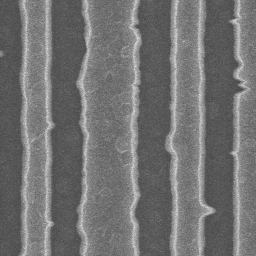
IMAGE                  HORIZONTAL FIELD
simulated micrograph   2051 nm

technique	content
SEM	one or a few lines or trenches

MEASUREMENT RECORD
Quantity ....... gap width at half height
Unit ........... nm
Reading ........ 275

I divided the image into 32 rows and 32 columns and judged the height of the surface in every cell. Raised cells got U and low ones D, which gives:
DDDUUUDDDDUUUUUUUDDDDDUUUDDDDDUU
DDDUUUDDDDDUUUUUUDDDDDUUUDDDDDUU
DDDUUUDDDDDUUUUUUDDDDDUUUDDDDUUU
DDDUUUDDDDDUUUUUUDDDDDUUUDDDDUUU
DDDUUUDDDDDUUUUUUDDDDDUUUDDDDDUU
DDDUUUDDDDDUUUUUUDDDDDUUUDDDDDUU
DDDUUUDDDDDUUUUUUDDDDDUUUDDDDDUU
DDDUUUDDDDDUUUUUUDDDDDUUUDDDDDUU
DDDUUUDDDDUUUUUUUDDDDDUUUDDDDDUU
DDDUUUDDDDUUUUUUUDDDDDUUUDDDDUUU
DDDUUUDDDDUUUUUUUDDDDDUUUDDDDDUU
DDDUUUDDDDUUUUUUUDDDDDUUUDDDDDUU
DDDUUUDDDDUUUUUUUDDDDDUUUDDDDDUU
DDDUUUDDDDUUUUUUUDDDDUUUUDDDDUUU
DDDUUUDDDDUUUUUUUDDDDDUUUDDDDDUU
DDDUUUDDDDUUUUUUUDDDDDUUUDDDDUUU
DDDUUUDDDDDUUUUUUDDDDUUUUDDDDUUU
DDDUUUDDDDDUUUUUUDDDDUUUUDDDDUUU
DDDUUUDDDDUUUUUUUDDDDUUUUDDDDUUU
DDDUUUDDDDUUUUUUUDDDDDUUUDDDDUUU
DDDUUUDDDDUUUUUUUDDDDDUUUDDDDUUU
DDDUUUDDDDUUUUUUUDDDDDUUUDDDDUUU
DDDUUUDDDDUUUUUUUDDDDDUUUDDDDUUU
DDDUUUDDDDUUUUUUUDDDDDUUUDDDDUUU
DDDUUUDDDDUUUUUUUDDDDDUUUDDDDUUU
DDDUUUDDDDUUUUUUUDDDDDUUUUDDDUUU
DDDUUUDDDDUUUUUUUDDDDDUUUUDDDUUU
DDDUUUDDDDUUUUUUUDDDDDUUUDDDDUUU
DDDUUUDDDDUUUUUUUDDDDDUUUDDDDUUU
DDDUUUDDDDUUUUUUUDDDDDUUUDDDDUUU
DDDUUUDDDDUUUUUUUDDDDDUUUDDDDUUU
DDDUUUDDDDUUUUUUUDDDDDUUUDDDDUUU